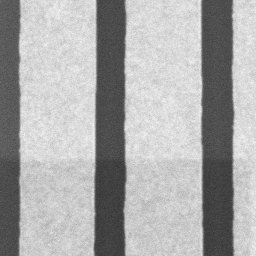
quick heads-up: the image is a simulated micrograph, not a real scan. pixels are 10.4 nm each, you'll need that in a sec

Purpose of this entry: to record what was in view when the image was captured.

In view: lines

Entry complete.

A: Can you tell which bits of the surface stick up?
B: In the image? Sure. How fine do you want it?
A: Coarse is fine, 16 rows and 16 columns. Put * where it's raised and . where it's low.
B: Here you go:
.*****..*****..*
.*****..*****..*
.*****..*****..*
.*****..*****..*
.*****..*****..*
.*****..*****..*
.*****..*****..*
.*****..*****..*
.*****..*****..*
.*****..*****..*
.*****..*****..*
.*****..*****..*
.*****..*****..*
.*****..*****..*
.*****..*****..*
.*****..*****..*